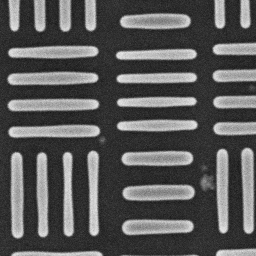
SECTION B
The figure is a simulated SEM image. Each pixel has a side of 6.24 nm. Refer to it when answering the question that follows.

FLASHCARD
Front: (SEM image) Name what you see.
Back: groups of lines, slits or small figures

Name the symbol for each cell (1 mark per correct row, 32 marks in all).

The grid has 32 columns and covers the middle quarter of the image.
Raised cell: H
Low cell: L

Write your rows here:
LLLLLLLLLLLLLLLLLLLLLLLLLLLLLLLL
LLLLLLLLLLLLLLLLLLLLLLLLLLLLLLLL
HHHHHHHHLLLLLLLLLLLLLLHHHHHHHHHH
HHHHHHHHLLLLLHHHHHHHHHHHHHHHHHHH
HHHHHHHHLLLLLLHHHHHHHHHHHHHHHHLL
LLLLLLLLLLLLLLLLLLLLLLLLLLLLLLLL
LLLLLLLLLLLLLLLLLLLLLLLLLLLLLLLL
LLLLLLLLLLLLLLLLLLLLLLLLLLLLLLLL
LLLLLLLLLLLLLLLLLLLLHHHHHHHHHHHH
HHHHHHHHLLLLLHHHHHHHHHHHHHHHHHHH
HHHHHHHHHLLLLLHHHHHHHHHHHHHLLLLL
LLLLLLLLLLLLLLLLLLLLLLLLLLLLLLLL
LLLLLLLLLLLLLLLLLLLLLLLLLLLLLLLL
LLLLLLLLLLLLLLLLLLLLLLLLLLLLLLLL
LLLLLLLLLLLLLLLHHHHHHHHHHHHHHHHH
HHHHHHHHLLLLLHHHHHHHHHHHHHHHHHHH
HHHHHHHHHLLLLLHHHHHHHHHHHHHHHLLL
HHHHHHHHHLLLLLLLLLLLLLLLLLLLLLLL
LLLLLLLLLLLLLLLLLLLLLLLLLLLLLLLL
LLLLLLLLLLLLLLLLLLLLLLLLLLLLLLLL
LLLLLLLLLLLLLLLLLLLLLLLLLLLLLLLL
LLLLLLLLLLLLLLLLLLLLLLLLLLLLLLLL
HHLLLLHHLLLLLLLHHHHHHHHHHHHHHHHH
HHLLLLHHLLLLLLLHHHHHHHHHHHHHHHHH
HHLLLLHHLLLLLLLHHHHHHHHHHHHHHHHH
HHLLLLHHLLLLLLLLLLLLLLLLLLLLLLLL
HHLLLLHHLLLLLLLLLLLLLLLLLLLLLLLL
HHLLLLHHLLLLLLLLLLLLLLLLLLLLLLLL
HHLLLLHHLLLLLLLLLLLLLLLLLLLLLLLL
HHLLLLHHLLLLLLLLLLLLLLLLLLLLLLLL
HHLLLLLHLLLLLLLLLLLLHHHHHHHHHHHH
HHLLLLLHLLLLLLLHHHHHHHHHHHHHHHHH